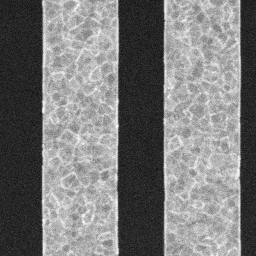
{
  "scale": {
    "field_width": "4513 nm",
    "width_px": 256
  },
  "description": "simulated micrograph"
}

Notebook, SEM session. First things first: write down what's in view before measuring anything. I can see wiring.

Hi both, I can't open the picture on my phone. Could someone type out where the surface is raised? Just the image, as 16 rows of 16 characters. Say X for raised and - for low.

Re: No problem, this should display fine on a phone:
---XXXX---XXXXX-
---XXXX---XXXXX-
---XXXX---XXXXX-
---XXXX---XXXXX-
---XXXX---XXXXX-
---XXXX---XXXXX-
---XXXX---XXXXX-
---XXXX---XXXXX-
---XXXX---XXXXX-
---XXXX---XXXXX-
---XXXX---XXXXX-
---XXXX---XXXXX-
---XXXX---XXXXX-
---XXXX---XXXXX-
---XXXX---XXXXX-
---XXXX---XXXXX-